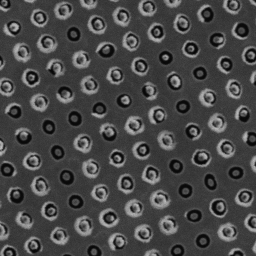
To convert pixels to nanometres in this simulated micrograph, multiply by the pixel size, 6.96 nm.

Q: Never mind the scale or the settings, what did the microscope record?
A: a regular array of ring-shaped grooves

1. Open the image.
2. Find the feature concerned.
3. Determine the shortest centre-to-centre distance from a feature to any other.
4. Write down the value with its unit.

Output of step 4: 182 nm